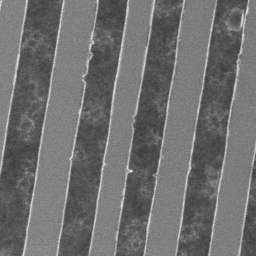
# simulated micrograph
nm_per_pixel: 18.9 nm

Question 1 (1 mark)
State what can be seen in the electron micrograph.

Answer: parallel lines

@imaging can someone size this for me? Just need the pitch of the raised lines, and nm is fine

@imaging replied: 1150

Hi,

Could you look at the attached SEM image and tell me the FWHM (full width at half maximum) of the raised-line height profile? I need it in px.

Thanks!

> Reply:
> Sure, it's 32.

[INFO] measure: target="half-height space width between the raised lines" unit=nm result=572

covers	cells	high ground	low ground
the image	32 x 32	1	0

00011111000011110001111000011110
00011111000011110001111000011110
00011111000011110001111000011110
00011110000011110001110000111100
00011110000011100001110000111100
00011110000111100001110000111100
00111110000111100011110000111100
00111110000111100011110000111100
00111110000111100011110000111100
00111100000111100011110000111100
00111100000111000011100001111000
00111100000111000111100001111000
01111100001111000111100001111000
01111100001111000111100001111000
01111100001111000111100001111000
01111000001111000111100001111000
01111000001111000111100011110000
01111000011110001111000011110000
01111000011110001111000011110000
11111000011110001111000011110000
11111000011110001111000011110000
11111000011110001111000011110001
11110000011110001111000111110001
11110000111110001110000111100001
11110000111100011110000111100001
11110000111100011110000111100001
11110000111100011110000111100001
11110000111100011110000111100011
11100000111100011100000111100011
11100000111100011100001111000011
11100001111000111100001111000011
11100001111000111100001111000011